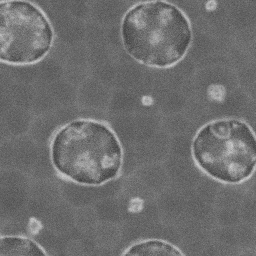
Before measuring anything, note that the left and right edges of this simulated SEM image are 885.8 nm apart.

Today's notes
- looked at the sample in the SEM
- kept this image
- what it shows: holes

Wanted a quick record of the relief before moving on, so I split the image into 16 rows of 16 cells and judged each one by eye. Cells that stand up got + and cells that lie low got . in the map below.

..++++++...+++++
...+++++....++++
...+++++....++++
...+++++...+++++
++++++++++++++++
++++++++++++++++
++++++++++++++++
++++++++++++++++
++++...+++++....
+++.....++++....
++++...++++++...
++++++++++++++++
++++++++++++++++
++++++++++++++++
++++++++++++++++
..++++++...+++++